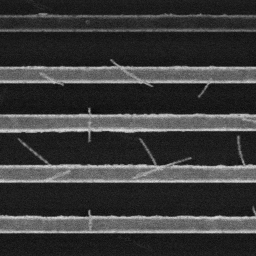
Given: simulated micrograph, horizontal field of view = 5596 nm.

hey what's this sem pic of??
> lines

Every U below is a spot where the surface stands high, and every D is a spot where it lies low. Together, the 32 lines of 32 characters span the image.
DDDDDDDDDDDDDDDDDDDDDDDDDDDDDDDD
DDDDDDDDDDDDDDDDDDDDDDDDDDDDDDDD
UUUUUUUUUUUUUUUUUUUUUUUUUUUUUUUU
UUUUUUUUUUUUUUUUUUUUUUUUUUUUUUUU
DDDDDDDDDDDDDDDDDDDDDDDDDDDDDDDD
DDDDDDDDDDDDDDDDDDDDDDDDDDDDDDDD
DDDDDDDDDDDDDDDDDDDDDDDDDDDDDDDD
DDDDDDDDDDDDDDDDDDDDDDDDDDDDDDDD
UUUUUUUUUUUUUUUUUUUUUUUUUUUUUUUU
UUUUUUUUUUUUUUUUUUUUUUUUUUUUUUUU
DDDDDDDDDDDDDDDDDDDDDDDDDDDDDDDD
DDDDDDDDDDDDDDDDDDDDDDDDDDDDDDDD
DDDDDDDDDDDDDDDDDDDDDDDDDDDDDDDD
DDDDDDDDDDDDDDDDDDDDDDDDDDDDDDDD
UUUUUUUUUUUUUUUUUUUUUUUUUUUUUDUU
UUUUUUUUUUUUUUUUUUUUUUUUUUUUUUUU
DDDDDDDDDDDDDDDDDDDDDDDDDDDDDDDD
DDDDDDDDDDDDDDDDDDDDDDDDDDDDDDDD
DDDDDDDDDDDDDDDDDDDDDDDDDDDDDDDD
DDDDDDDDDDDDDDDDDDDDDDDDDDDDDDDD
DDDDDDDDDDDDDDDDDDDDDDDDDDDDDDDD
UUUUUUUUUUUUUUUUUUUUUUUUUUUUUUUU
UUUUUUUUUUUUUUUUUUUUUUUUUUUUUUUU
DDDDDDDDDDDDDDDDDDDDDDDDDDDDDDDD
DDDDDDDDDDDDDDDDDDDDDDDDDDDDDDDD
DDDDDDDDDDDDDDDDDDDDDDDDDDDDDDDD
DDDDDDDDDDDDDDDDDDDDDDDDDDDDDDDD
UUUUUUUUUUUUUUUUUUUUUUUUUUUUUUUU
UUUUUUUUUUUUUUUUUUUUUUUUUUUUUUUU
DDDDDDDDDDDDDDDDDDDDDDDDDDDDDDDD
DDDDDDDDDDDDDDDDDDDDDDDDDDDDDDDD
DDDDDDDDDDDDDDDDDDDDDDDDDDDDDDDD